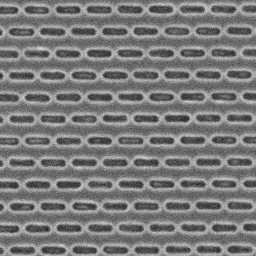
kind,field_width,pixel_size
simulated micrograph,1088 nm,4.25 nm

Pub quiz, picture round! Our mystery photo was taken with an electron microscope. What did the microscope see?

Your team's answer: a regular array of holes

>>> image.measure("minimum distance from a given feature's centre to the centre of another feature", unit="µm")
0.113